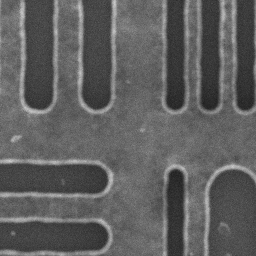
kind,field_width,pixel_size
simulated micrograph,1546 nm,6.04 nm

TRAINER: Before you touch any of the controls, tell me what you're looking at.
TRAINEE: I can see groups of lines, slits or small figures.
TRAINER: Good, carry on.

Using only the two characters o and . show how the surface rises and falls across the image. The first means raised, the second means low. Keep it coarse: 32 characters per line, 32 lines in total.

ooo....ooo....ooooooo..oo...o...
ooo....ooo....ooooooo..oo...o...
ooo....ooo....ooooooo..oo...o...
ooo....ooo....ooooooo..oo...o...
ooo....ooo....ooooooo..oo...o...
ooo....ooo....ooooooo..oo...o...
ooo....ooo....ooooooo..oo...o...
ooo....ooo....ooooooo..oo...o...
ooo....ooo....ooooooo..oo...o...
ooo....ooo....ooooooo..oo...o...
ooo....ooo....ooooooo..oo...o...
ooo....ooo....ooooooo..oo...o...
ooo....ooo....ooooooo..oo...o...
oooo..ooooo..oooooooo..oo..ooo..
oooooooooooooooooooooooooooooooo
oooooooooooooooooooooooooooooooo
oooooooooooooooooooooooooooooooo
oooooooooooooooooooooooooooooooo
oooooooooooooooooooooooooooooooo
oooooooooooooooooooooooooooooooo
............oooooooooooooooooooo
..............ooooooo..oooo....o
..............ooooooo..ooo......
.............oooooooo..ooo......
ooooooooooooooooooooo..ooo......
ooooooooooooooooooooo..ooo......
ooooooooooooooooooooo..ooo......
......ooooooooooooooo..ooo......
.............oooooooo..ooo......
..............ooooooo..ooo......
..............ooooooo..ooo......
............ooooooooo..ooo......